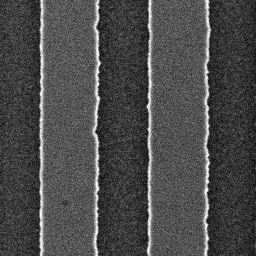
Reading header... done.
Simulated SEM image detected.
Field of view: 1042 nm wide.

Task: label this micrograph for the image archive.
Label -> lines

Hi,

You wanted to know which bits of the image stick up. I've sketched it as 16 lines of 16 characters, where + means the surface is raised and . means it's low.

...+++...++++...
...+++...++++...
...+++...++++...
...+++...++++...
...+++...++++...
...+++...++++...
...+++...++++...
...+++...++++...
...+++...++++...
...+++...++++...
...+++...++++...
...+++...++++...
...+++...++++...
...+++...++++...
...+++...++++...
...+++...++++...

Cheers